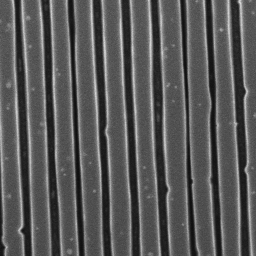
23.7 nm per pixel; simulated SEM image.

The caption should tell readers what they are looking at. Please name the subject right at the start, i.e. parallel lines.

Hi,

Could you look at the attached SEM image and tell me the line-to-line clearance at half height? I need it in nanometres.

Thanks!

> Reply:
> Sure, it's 198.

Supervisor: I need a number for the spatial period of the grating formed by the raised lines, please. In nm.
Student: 641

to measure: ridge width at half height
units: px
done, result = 19.5